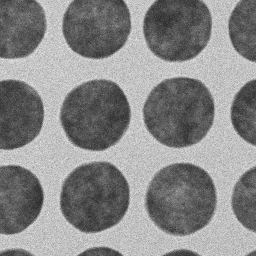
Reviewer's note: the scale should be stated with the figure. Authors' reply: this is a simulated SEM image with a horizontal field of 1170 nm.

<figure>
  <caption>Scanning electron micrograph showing holes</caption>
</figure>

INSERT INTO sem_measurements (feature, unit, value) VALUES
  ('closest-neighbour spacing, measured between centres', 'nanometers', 379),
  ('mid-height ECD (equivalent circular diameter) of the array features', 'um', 0.323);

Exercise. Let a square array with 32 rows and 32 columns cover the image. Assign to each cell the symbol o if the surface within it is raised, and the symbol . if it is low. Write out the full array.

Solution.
.....oooo.......ooo.......oooo..
.....ooo........oo........ooo...
......oo........oo........ooo...
......oo........oo........oo....
.....ooo........oo........ooo...
.....ooo........oo........ooo...
....ooooo......oooo......ooooo..
oooooooooooooooooooo...oooooooo.
oooooooooooooooooooooooooooooooo
oooooooooooooooooooooooooooooooo
...ooooooo.....ooooo.....oooooo.
.....oooo......oooo.......oooo..
.....ooo........oo.........oo...
.....ooo........oo.........oo...
.....ooo........oo.........oo...
.....ooo........oo.........oo...
.....ooo........ooo.......oooo..
....ooooo......ooooo.....oooooo.
..oooooooo...ooooooooo.ooooooooo
oooooooooooooooooooooooooooooooo
ooooooooooo...oooooooo..oooooooo
....ooooo......ooooo......ooooo.
.....ooo........ooo.......oooo..
.....ooo........ooo........oo...
.....ooo........oo.........oo...
.....oo.........oo.........oo...
.....ooo........oo.........oo...
....oooo.......oooo.......oooo..
...ooooooo....oooooo.....oooooo.
oooooooooooooooooooooooooooooooo
oooooooooooooooooooooooooooooooo
...ooooooo.....oooooo...ooooooo.